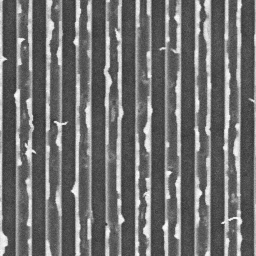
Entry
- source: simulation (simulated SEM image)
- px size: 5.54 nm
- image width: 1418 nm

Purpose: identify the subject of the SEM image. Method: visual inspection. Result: parallel lines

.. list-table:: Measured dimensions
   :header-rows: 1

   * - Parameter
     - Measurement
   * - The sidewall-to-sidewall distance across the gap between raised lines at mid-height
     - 82.5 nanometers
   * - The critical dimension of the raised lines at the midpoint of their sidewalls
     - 0.0831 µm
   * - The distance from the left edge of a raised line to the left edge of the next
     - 165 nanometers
